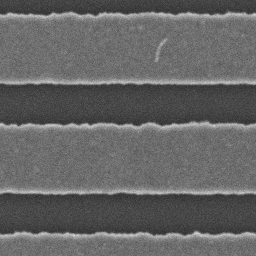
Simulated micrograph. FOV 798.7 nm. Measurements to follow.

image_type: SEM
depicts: lines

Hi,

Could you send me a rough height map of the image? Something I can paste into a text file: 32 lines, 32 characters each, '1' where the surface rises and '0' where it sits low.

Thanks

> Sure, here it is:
00000000000000000000000000000000
00000000000000000000000000000000
11111111111111111111111111111111
11111111111111111111111111111111
11111111111111111111111111111111
11111111111111111111111111111111
11111111111111111111111111111111
11111111111111111111111111111111
11111111111111111111111111111111
11111111111111111111111111111111
00000000000000000000000000000000
00000000000000000000000000000000
00000000000000000000000000000000
00000000000000000000000000000000
00000000000000000000000000000000
00000000000011000011000111011100
11111111111111111111111111111111
11111111111111111111111111111111
11111111111111111111111111111111
11111111111111111111111111111111
11111111111111111111111111111111
11111111111111111111111111111111
11111111111111111111111111111111
11111111111111111111111111111111
00000000000000000000000000000000
00000000000000000000000000000000
00000000000000000000000000000000
00000000000000000000000000000000
00000000000000000000000000000000
11111111111111111111111111111111
11111111111111111111111111111111
11111111111111111111111111111111